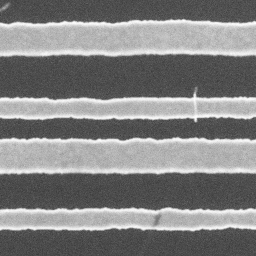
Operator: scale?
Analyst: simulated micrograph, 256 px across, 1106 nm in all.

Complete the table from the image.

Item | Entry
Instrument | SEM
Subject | lines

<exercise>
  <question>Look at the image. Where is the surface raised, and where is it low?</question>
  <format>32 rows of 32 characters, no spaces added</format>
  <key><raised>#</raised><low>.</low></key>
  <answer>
................................
................................
................................
################################
################################
################################
################################
................................
................................
................................
................................
................................
################################
################################
################################
................................
................................
###########.###.###.######.####.
################################
################################
################################
#####################.##########
................................
................................
................................
................................
################################
################################
##############.#.###########..##
................................
................................
................................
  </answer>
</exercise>